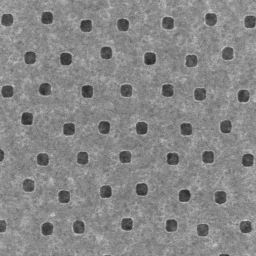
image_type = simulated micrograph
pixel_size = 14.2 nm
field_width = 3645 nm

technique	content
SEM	a regular array of holes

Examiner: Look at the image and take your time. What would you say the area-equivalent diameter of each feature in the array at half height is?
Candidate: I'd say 199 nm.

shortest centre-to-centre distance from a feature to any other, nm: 486